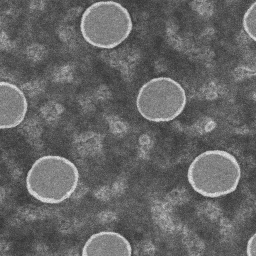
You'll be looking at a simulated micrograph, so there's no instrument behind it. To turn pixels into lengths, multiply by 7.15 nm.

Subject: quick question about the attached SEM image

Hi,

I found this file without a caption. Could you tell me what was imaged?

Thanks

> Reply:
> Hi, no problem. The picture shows raised bodies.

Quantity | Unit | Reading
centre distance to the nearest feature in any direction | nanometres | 659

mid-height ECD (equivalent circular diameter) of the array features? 338 nanometers